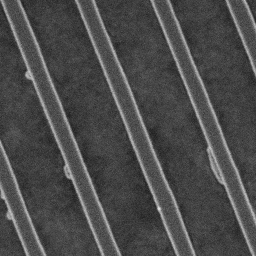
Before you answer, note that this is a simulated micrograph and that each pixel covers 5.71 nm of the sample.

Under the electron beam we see lines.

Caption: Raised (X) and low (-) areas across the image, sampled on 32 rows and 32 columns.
XXX-------XX-------XX-------XXX-
-XX-------XX-------XXX-------XX-
-XX-------XXX-------XX-------XXX
-XXX-------XX-------XXX-------XX
--XX-------XXX-------XX-------XX
--XXX-------XX-------XX-------XX
---XX-------XX--------XX-------X
---XX-------XXX-------XX-------X
---XXX-------XX-------XX--------
----XX-------XXX-------XX-------
----XXX-------XX-------XX-------
-----XX-------XX-------XXX------
-----XX-------XXX-------XX------
-----XXX-------XX-------XXX-----
------XX-------XXX-------XX-----
------XXX-------XX-------XX-----
-------XX-------XX-------XXX----
-------XX-------XXX-------XX----
-------XXX-------XX-------XX----
X-------XX-------XXX------XXX---
X-------XXX------XXX------XXX---
XX------XXX-------XX-------XXX--
XX-------XX-------XXX------XXX--
XX-------XXX-------XX-------XX--
XXX-------XX-------XXX-------XX-
-XX-------XXX-------XX-------XX-
-XX--------XX-------XX-------XXX
-XXX-------XX-------XXX-------XX
--XX-------XXX-------XX-------XX
--XXX-------XX-------XX--------X
---XX-------XX--------XX-------X
---XXX-------XX-------XX-------X